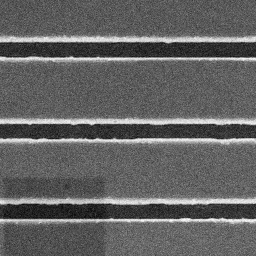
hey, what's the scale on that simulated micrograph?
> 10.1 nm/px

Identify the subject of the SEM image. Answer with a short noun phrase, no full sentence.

lines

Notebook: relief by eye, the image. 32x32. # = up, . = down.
################################
################################
################################
################################
################################
................................
................................
################################
################################
################################
################################
################################
################################
################################
################################
................................
................................
.................##...........#.
################################
################################
################################
################################
################################
################################
################################
................................
................................
################################
################################
################################
################################
################################